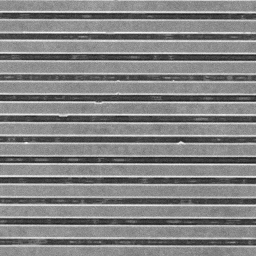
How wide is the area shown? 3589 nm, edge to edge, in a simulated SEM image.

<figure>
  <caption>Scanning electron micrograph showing parallel lines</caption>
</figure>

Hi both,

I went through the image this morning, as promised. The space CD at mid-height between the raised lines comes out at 98.2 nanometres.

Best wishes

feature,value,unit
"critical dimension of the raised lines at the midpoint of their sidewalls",195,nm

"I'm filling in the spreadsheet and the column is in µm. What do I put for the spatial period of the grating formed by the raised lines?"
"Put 0.288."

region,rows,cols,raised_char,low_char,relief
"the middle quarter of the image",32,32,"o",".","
oooooooooooooooooooooooooooooooo
oooooooooooooooooooooooooooooooo
................................
................................
oooooooooooooooooooooooooooooooo
oooooooooooooooooooooooooooooooo
oooooooooooooooooooooooooooooooo
oooooooooooooooooooooooooooooooo
................................
................................
oooooooooooooooooooooooooooooooo
oooooooooooooooooooooooooooooooo
oooooooooooooooooooooooooooooooo
................................
................................
oooooooooooooooooooooooooooooooo
oooooooooooooooooooooooooooooooo
oooooooooooooooooooooooooooooooo
................................
.............................o..
oooooooooooooooooooooooooooooooo
oooooooooooooooooooooooooooooooo
oooooooooooooooooooooooooooooooo
................................
................................
oooooooooooooooooooooooooooooooo
oooooooooooooooooooooooooooooooo
oooooooooooooooooooooooooooooooo
................................
................................
oooooooooooooooooooooooooooooooo
oooooooooooooooooooooooooooooooo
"